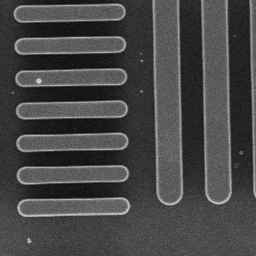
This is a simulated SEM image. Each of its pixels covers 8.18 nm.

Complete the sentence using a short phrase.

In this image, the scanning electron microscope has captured groups of lines, slits or small figures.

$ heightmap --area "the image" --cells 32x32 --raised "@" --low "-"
-------------------@@@---@@@---@
--@@@@@@@@@@@@@@---@@@---@@@---@
--@@@@@@@@@@@------@@@---@@@---@
-------------------@@@---@@@---@
-------------------@@@---@@@---@
--@@@@@@@@@@@@@@---@@@---@@@---@
--@@@@@@@@@@@@@----@@@---@@@@--@
-------------------@@@---@@@@--@
-------------------@@@---@@@@--@
--@@@@@@@@@@@@@@---@@@---@@@@--@
--@@@@@@@@@@@@@----@@@@--@@@@--@
-------------------@@@@--@@@@---
-------------------@@@@--@@@@---
--@@@@@@@@@@@@@@---@@@@---@@@---
--@@@@@@@@@@@@@----@@@@---@@@---
-------------------@@@@---@@@---
--------------------@@@---@@@---
--@@@@@@@@@@@@@@----@@@---@@@---
--@@@@@@@@@@@@@-----@@@---@@@---
--------------------@@@---@@@---
--------------------@@@---@@@---
--@@@@@@@@@@@@@@----@@@---@@@---
--@@@@@@@@@@@@@@----@@@---@@@---
--------------------@@@---@@@---
--------------------@@@---@@@---
--@@@@@@@@@@@@@@----------------
--@@@@@@@@@@@@@@----------------
--------------------------------
--------------------------------
--------------------------------
--------------------------------
--------------------------------